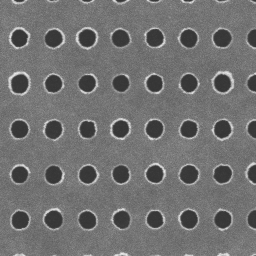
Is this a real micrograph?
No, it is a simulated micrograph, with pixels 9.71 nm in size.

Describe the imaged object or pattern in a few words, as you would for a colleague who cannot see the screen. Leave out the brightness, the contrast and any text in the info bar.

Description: a regular array of holes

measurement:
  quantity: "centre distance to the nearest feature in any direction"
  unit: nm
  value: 325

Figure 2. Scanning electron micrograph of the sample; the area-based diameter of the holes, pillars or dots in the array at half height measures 169 nm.